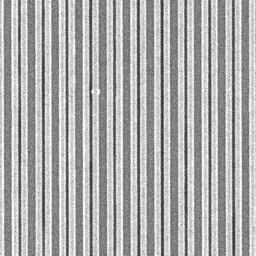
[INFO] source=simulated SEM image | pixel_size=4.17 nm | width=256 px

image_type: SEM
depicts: parallel lines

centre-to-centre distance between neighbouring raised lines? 49.3 nm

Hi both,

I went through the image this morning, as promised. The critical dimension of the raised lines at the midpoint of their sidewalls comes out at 22.9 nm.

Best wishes